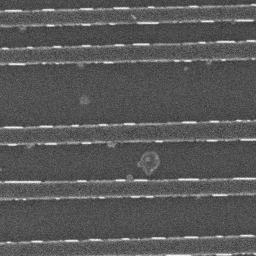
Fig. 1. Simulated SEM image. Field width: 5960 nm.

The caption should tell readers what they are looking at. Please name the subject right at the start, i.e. lines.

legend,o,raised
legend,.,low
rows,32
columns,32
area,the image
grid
................................
oooooooooooooooooooooooooooooooo
ooooooooooooooooooooooooooooo...
................................
................................
.......................ooooooooo
oooooooooooooooooooooooooooooooo
oooooooooooooooooooooooooooo....
................................
................................
................................
................................
................................
................................
................................
.....................ooooooooooo
oooooooooooooooooooooooooooooooo
ooooooooooooooooooooooooo.......
................................
..................o.............
..................o.............
................................
..........................oooooo
oooooooooooooooooooooooooooooooo
oooooooooooooooooooooo..........
................................
................................
................................
................................
................................
oooooooooooooooooooooooooooooooo
oooooooooooooooooooooooooooooooo